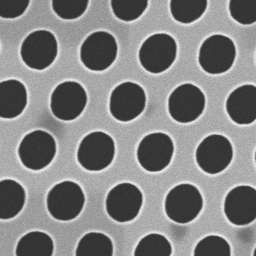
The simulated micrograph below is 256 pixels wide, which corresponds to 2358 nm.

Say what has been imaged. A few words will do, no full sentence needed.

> a regular array of holes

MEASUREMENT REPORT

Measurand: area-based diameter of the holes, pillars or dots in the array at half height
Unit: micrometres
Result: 0.35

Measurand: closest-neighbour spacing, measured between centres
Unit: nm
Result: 533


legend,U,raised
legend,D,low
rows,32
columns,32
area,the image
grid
DDDDUUDDDDDUUUDDDDUUUDDDDDUUUDDD
DDDUUUUDDDUUUUDDDDUUUDDDDUUUUDDD
UUUUUUUUUUUUUUUDDUUUUUDDUUUUUDDD
UUUUUUUUUUUUUUUUUUUUUUUUUUUUUUUU
UUUDDDDUUUUDDDUUUUUDDUUUUUDDUUUU
UUUDDDDUUUDDDDDUUUDDDDUUUDDDDUUU
UUUDDDDUUUDDDDDUUDDDDDUUUDDDDUUU
UUUDDDDUUUDDDDUUUDDDDDUUUDDDDUUU
UUUUDDUUUUUDDUUUUUDDDUUUUDDDDUUU
UUUUUUUUUUUUUUUUUUUUUUUUUUUUUUUU
DDDUUUUDDDUUUUUDDUUUUUUDUUUUUUUU
DDDUUUUDDDDUUUDDDDUUUUDDDUUUUDDD
DDDUUUDDDDDUUUDDDDUUUDDDDDUUDDDD
DDDUUUDDDDDUUUDDDDUUUDDDDUUUDDDD
DDUUUUUDDDUUUUDDDUUUUDDDDUUUUDDD
UUUUUUUUUUUUUUUUUUUUUUUUUUUUUUDU
UUUUDDUUUUUUUUUUUUUUUUUUUUUUUUUU
UUUDDDDUUUDDDDUUUUDDDUUUUDDDUUUU
UUDDDDDUUUDDDDUUUDDDDDUUUDDDDUUU
UUDDDDDUUUDDDDUUUDDDDUUUDDDDDUUU
UUUDDDUUUUDDDDUUUUDDDUUUUDDDDUUU
UUUUUUUUUUUUUUUUUUUUUUUUUUDUUUUU
UDUUUUUUUUUUUUUUUUUUUUUUUUUUUUUU
DDDUUUUDDDUUUUDDDUUUUUDDDUUUUDDD
DDDUUUDDDDDUUDDDDDUUUDDDDUUUDDDD
DDDUUUDDDDUUUDDDDDUUUDDDDUUUDDDD
DDUUUUDDDDUUUDDDDUUUUDDDDUUUDDDD
UUUUUUUUDUUUUUDDUUUUUUDDUUUUUDDD
UUUUUUUUUUUUUUUUUUUUUUUUUUUUUUUU
UUUDDDUUUUUDDUUUUUDDUUUUUUDUUUUU
UUDDDDDUUUDDDDUUUDDDDUUUUDDDDUUU
UUDDDDDUUUDDDDUUUDDDDUUUDDDDDUUU